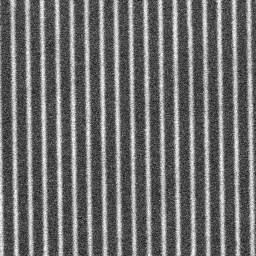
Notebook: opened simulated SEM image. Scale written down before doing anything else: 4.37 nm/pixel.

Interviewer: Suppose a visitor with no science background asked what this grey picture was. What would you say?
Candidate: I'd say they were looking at parallel lines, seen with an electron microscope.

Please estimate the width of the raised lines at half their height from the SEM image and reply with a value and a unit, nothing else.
15.3 nanometres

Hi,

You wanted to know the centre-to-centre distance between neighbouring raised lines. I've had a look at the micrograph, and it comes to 64.5 nm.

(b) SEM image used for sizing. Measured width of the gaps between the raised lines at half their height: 50.2 nm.